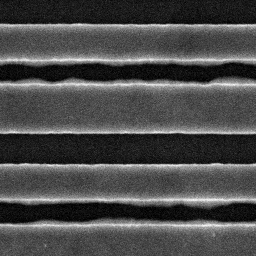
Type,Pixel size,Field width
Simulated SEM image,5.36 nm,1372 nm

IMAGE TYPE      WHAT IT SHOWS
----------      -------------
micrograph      lines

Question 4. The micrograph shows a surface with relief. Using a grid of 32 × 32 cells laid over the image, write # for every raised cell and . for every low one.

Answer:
................................
................................
................................
################################
################################
################################
################################
################################
................................
................................
######.#####..#####.......######
################################
################################
################################
################################
################################
################################
................................
................................
................................
...#......................##....
################################
################################
################################
################################
................................
................................
................................
################################
################################
################################
################################